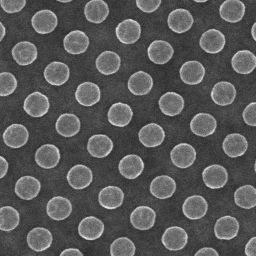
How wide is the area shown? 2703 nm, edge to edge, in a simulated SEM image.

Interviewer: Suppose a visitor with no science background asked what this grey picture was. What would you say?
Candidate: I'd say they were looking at a regular array of raised bodies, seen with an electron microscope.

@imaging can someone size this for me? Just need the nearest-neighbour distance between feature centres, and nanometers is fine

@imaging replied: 392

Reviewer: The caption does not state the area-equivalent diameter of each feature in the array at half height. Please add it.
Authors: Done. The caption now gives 0.254 um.